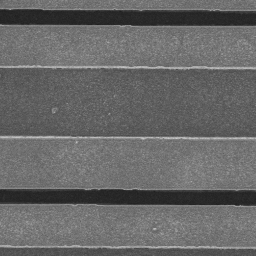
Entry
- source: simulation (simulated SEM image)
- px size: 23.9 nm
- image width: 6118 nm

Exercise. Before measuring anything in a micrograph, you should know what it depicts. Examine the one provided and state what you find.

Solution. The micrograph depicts lines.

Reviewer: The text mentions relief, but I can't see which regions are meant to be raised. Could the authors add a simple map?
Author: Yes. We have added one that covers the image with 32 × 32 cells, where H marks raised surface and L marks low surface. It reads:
HHHHHHHHHHHHHHHHHHHHHHHHHHHHHHHH
LLLLLLLLLLLLLLLLLLLLLLLLLLLLLLLL
LLLLLLLLLLLLLLLLLLLLLLLLLLLLLLLL
HHHHHHHHHHHHHHHHHHHHHHHHHHHHHHHH
HHHHHHHHHHHHHHHHHHHHHHHHHHHHHHHH
HHHHHHHHHHHHHHHHHHHHHHHHHHHHHHHH
HHHHHHHHHHHHHHHHHHHHHHHHHHHHHHHH
HHHHHHHHHHHHHHHHHHHHHHHHHHHHHHHH
LLLLLLLLLLLLLLLLLLLLLLLLLLLLLLLL
LLLLLLLLLLLLLLLLLLLLLLLLLLLLLLLL
LLLLLLLLLLLLLLLLLLLLLLLLLLLLLLLL
LLLLLLLLLLLLLLLLLLLLLLLLLLLLLLLL
LLLLLLLLLLLLLLLLLLLLLLLLLLLLLLLL
LLLLLLLLLLLLLLLLLLLLLLLLLLLLLLLL
LLLLLLLLLLLLLLLLLLLLLLLLLLLLLLLL
LLLLLLLLLLLLLLLLLLLLLLLLLLLLLLLL
LLLLLLLLLLLLLLLLLLLLLLLLLLLLLLLL
HHHHHHHHHHHHHHHHHHHHHHHHHHHHHHHH
HHHHHHHHHHHHHHHHHHHHHHHHHHHHHHHH
HHHHHHHHHHHHHHHHHHHHHHHHHHHHHHHH
HHHHHHHHHHHHHHHHHHHHHHHHHHHHHHHH
HHHHHHHHHHHHHHHHHHHHHHHHHHHHHHHH
HHHHHHHHHHHHHHHHHHHHHHHHHHHHHHHH
HHHHHHHHHHHHHHHHHHHHHHHHHHHHHHHH
LLLLLLLLLLLLLLLLLLLLLLLLLLLLLLLL
LLLLLLLLLLLLLLLLLLLLLLLLLLLLLLLL
HHHHHHHHHHHHHHHHHHHHHHHHHHHHHHHH
HHHHHHHHHHHHHHHHHHHHHHHHHHHHHHHH
HHHHHHHHHHHHHHHHHHHHHHHHHHHHHHHH
HHHHHHHHHHHHHHHHHHHHHHHHHHHHHHHH
HHHHHHHHHHHHHHHHHHHHHHHHHHHHHHHH
LLLLLLLLLLLLLLLLLLLLLLLLLLLLLLLL